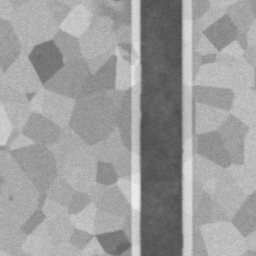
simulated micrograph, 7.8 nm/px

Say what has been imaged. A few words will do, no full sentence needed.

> one or a few lines or trenches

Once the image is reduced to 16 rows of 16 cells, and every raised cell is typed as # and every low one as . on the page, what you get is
########....####
########....####
########....####
########....####
########....####
########....####
########....####
########....####
########....####
########....####
########....####
########....####
########....####
########....####
########....####
########....####